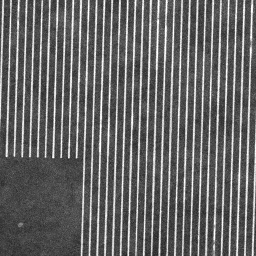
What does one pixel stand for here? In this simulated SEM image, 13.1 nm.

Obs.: parallel lines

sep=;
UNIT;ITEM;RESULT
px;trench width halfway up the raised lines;6.87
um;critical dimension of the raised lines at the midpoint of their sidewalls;0.0131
